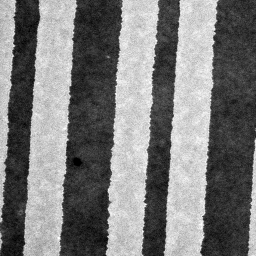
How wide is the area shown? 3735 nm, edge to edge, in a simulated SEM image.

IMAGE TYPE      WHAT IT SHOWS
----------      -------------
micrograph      one or a few lines or trenches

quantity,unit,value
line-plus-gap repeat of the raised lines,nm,1030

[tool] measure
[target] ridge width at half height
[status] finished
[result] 515 nanometres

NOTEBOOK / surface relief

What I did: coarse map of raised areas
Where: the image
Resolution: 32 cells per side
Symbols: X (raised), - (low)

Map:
XX---XXXX------XXXXX---XXXX-----
XX---XXXX------XXXXX---XXXX-----
XX---XXXX------XXXXX--XXXXX-----
XX---XXXX------XXXXX--XXXXX-----
XX---XXXX------XXXX---XXXXX-----
XX---XXXX------XXXX---XXXXX-----
XX---XXXX------XXXX---XXXXX-----
XX---XXXX------XXXX---XXXXX-----
X---XXXXX------XXXX---XXXXX-----
X---XXXXX------XXXX---XXXX------
X---XXXXX------XXXX---XXXXX-----
X---XXXXX------XXXX---XXXX------
X---XXXXX------XXXX---XXXX------
X---XXXX-------XXXX---XXXX------
X---XXXX------XXXXX---XXXX------
X---XXXX------XXXXX---XXXX------
X---XXXX------XXXXX--XXXXX------
X---XXXX------XXXXX--XXXXX------
X---XXXX------XXXX---XXXXX------
X---XXXX------XXXX---XXXXX------
X---XXXX------XXXX---XXXXX------
X---XXXX------XXXX---XXXXX------
X---XXXX------XXXX---XXXXX------
---XXXXX------XXXX---XXXXX------
----XXXX------XXXX---XXXXX-----X
---XXXXX------XXXX---XXXXX-----X
---XXXXX------XXXX---XXXXX-----X
---XXXXX------XXXX---XXXX------X
---XXXXX------XXXX---XXXX------X
---XXXX-------XXXX---XXXX------X
---XXXX------XXXXX---XXXX------X
---XXXX------XXXXX---XXXX------X